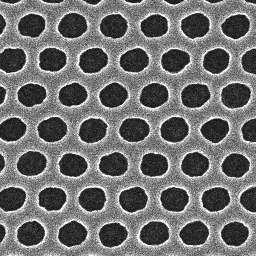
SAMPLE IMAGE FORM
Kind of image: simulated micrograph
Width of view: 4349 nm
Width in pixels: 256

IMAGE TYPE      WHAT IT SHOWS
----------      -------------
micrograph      a regular array of holes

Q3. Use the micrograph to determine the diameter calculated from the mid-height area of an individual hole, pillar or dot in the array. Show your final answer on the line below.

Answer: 453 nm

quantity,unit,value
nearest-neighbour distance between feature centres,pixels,39.8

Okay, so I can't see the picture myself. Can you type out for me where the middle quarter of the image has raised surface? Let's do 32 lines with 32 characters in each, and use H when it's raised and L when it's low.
HHHHLLLLLLLHHHLLLLLLLHHHLLLLLLHH
HHHHLLLLLHHHHHHLLLLLHHHHHLLLLHHH
HHHHHHLHHHHHHHHHHHHHHHHHHHHHHHHH
HHHHHHHHHHHHHHHHHHHHHHHHHHHHHHHH
HHHHHHHHHHHHHHHHHHHHHHHHHHHHHHHH
LLLLLHHHHHHLLLLHHHHHLLLLLHHHHHHL
LLLLLLHHHLLLLLLLHHHLLLLLLLHHHHLL
LLLLLLHHHLLLLLLLHHHLLLLLLLHHHLLL
LLLLLLHHHLLLLLLLHHHLLLLLLLHHHLLL
LLLLLHHHHLLLLLLHHHHLLLLLLHHHHLLL
LLLHHHHHHHLLLLHHHHHHLLLLHHHHHHLL
HHHHHHHHHHHHHHHHHHHHHHHHHHHHHHHH
HHHHHHHHHHHHHHHHHHHHHHHHHHHHHHHH
HHHHHHHHHHHHHHHHLLLHHHHHHHHLLLHH
HHHHHLLLLLHHHHHLLLLLLHHHHLLLLLLH
LHHHLLLLLLLHHHLLLLLLLHHHLLLLLLLH
LHHHLLLLLLLHHHLLLLLLLHHHLLLLLLLH
LHHHLLLLLLLHHHLLLLLLLHHHLLLLLLLH
HHHHLLLLLLHHHHHLLLLLHHHHLLLLLLHH
HHHHHLLLHHHHHHHHHLHHHHHHHHHLHHHH
HHHHHHHHHHHHHHHHHHHHHHHHHHHHHHHH
HHHHHHHHHHHHHHHHHHHHHHHHHHHHHHHH
LLLHHHHHHHHHLLHHHHHHHLLLHHHHHHHL
LLLLLHHHHLLLLLLLHHHHLLLLLLHHHHLL
LLLLLLHHHLLLLLLLHHHLLLLLLLHHHHLL
LLLLLLHHHLLLLLLLHHHLLLLLLLHHHLLL
LLLLLLHHHLLLLLLLHHHLLLLLLLHHHLLL
LLLLLHHHHHLLLLLHHHHHLLLLLHHHHHLL
HHHHHHHHHHHHHHHHHHHHHHHHHHHHHHHH
HHHHHHHHHHHHHHHHHHHHHHHHHHHHHHHH
HHHHHHHHHHHHHHHHHHHHHHHHHHHHHHHH
HHHHHLLLLLHHHHHLLLLLHHHHHLLLLLHH